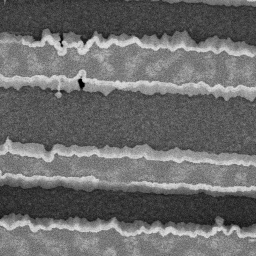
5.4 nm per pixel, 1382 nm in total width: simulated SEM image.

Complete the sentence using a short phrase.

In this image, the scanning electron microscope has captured one or a few lines or trenches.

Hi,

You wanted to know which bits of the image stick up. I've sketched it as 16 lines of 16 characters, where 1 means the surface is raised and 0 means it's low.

0000000000000000
0000000000000000
1111001111000000
1111111111111111
1111111111111111
0000000111111111
0000000000000000
0000000000000000
0000000000000000
1111111110000000
1111111111111111
0000111111111111
0000000000000000
0000000000000000
1111111111111111
1111111111111111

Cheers